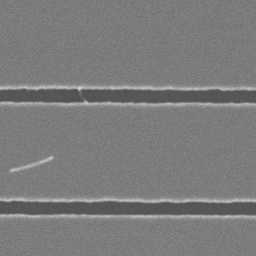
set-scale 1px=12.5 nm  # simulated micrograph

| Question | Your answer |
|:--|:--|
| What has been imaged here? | lines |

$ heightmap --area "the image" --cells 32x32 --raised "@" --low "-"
@@@@@@@@@@@@@@@@@@@@@@@@@@@@@@@@
@@@@@@@@@@@@@@@@@@@@@@@@@@@@@@@@
@@@@@@@@@@@@@@@@@@@@@@@@@@@@@@@@
@@@@@@@@@@@@@@@@@@@@@@@@@@@@@@@@
@@@@@@@@@@@@@@@@@@@@@@@@@@@@@@@@
@@@@@@@@@@@@@@@@@@@@@@@@@@@@@@@@
@@@@@@@@@@@@@@@@@@@@@@@@@@@@@@@@
@@@@@@@@@@@@@@@@@@@@@@@@@@@@@@@@
@@@@@@@@@@@@@@@@@@@@@@@@@@@@@@@@
@@@@@@@@@@@@@@@@@@@@@@@@@@@@@@@@
@@@@@@@@@@@@@@@@@@@@@@@@@@@@@@@@
--------------------------------
--------------------------------
@@@@@@@@@@@@@@@@@@@@@@@@@@@@@@@@
@@@@@@@@@@@@@@@@@@@@@@@@@@@@@@@@
@@@@@@@@@@@@@@@@@@@@@@@@@@@@@@@@
@@@@@@@@@@@@@@@@@@@@@@@@@@@@@@@@
@@@@@@@@@@@@@@@@@@@@@@@@@@@@@@@@
@@@@@@@@@@@@@@@@@@@@@@@@@@@@@@@@
@@@@@@@@@@@@@@@@@@@@@@@@@@@@@@@@
@@@@@@@@@@@@@@@@@@@@@@@@@@@@@@@@
@@@@@@@@@@@@@@@@@@@@@@@@@@@@@@@@
@@@@@@@@@@@@@@@@@@@@@@@@@@@@@@@@
@@@@@@@@@@@@@@@@@@@@@@@@@@@@@@@@
@@@@@@@@@@@@@@@@@@@@@@@@@@@@@@@@
--------------------------------
--------------------------------
@@@@@@@@@@@@@@@@@@@@@@@@@@@@@@@@
@@@@@@@@@@@@@@@@@@@@@@@@@@@@@@@@
@@@@@@@@@@@@@@@@@@@@@@@@@@@@@@@@
@@@@@@@@@@@@@@@@@@@@@@@@@@@@@@@@
@@@@@@@@@@@@@@@@@@@@@@@@@@@@@@@@